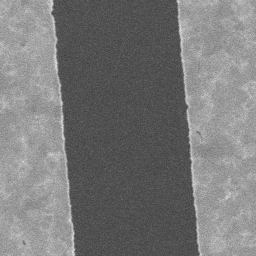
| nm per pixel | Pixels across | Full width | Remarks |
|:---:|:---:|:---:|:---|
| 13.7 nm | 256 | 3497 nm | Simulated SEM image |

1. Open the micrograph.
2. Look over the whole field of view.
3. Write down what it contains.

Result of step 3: one or a few lines or trenches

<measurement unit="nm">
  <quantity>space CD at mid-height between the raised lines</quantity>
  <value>1710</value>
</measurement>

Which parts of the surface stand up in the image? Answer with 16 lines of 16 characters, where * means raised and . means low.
***........*****
***........*****
***........*****
****.......*****
****.......*****
****........****
****........****
****........****
****........****
****........****
****........****
****........****
****........****
****........****
*****.......****
*****.......****